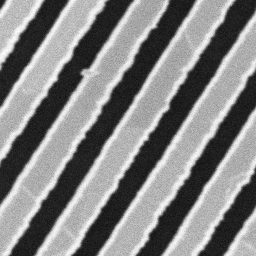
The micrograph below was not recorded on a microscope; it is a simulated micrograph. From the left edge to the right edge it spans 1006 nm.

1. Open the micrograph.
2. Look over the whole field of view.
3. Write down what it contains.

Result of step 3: lines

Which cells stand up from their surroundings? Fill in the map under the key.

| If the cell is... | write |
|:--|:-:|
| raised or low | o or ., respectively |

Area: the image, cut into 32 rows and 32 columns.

.oooo...ooooo...ooooo...ooooo...
ooooo...oooo....oooo....oooo....
oooo...ooooo...ooooo...ooooo...o
ooo...ooooo...ooooo...ooooo....o
oo....oooo....oooo....ooooo...oo
oo...ooooo...ooooo...ooooo...ooo
o....oooo....oooo...ooooo....ooo
o...ooooo...ooooo...ooooo...oooo
...ooooo...ooooo...ooooo...ooooo
...oooo...ooooo....oooo....oooo.
..ooooo...ooooo...ooooo...ooooo.
.ooooo...ooooo...ooooo...ooooo..
.oooo....oooo....oooo....ooooo..
ooooo...ooooo...ooooo...ooooo...
oooo...ooooo....oooo...ooooo...o
ooo....ooooo...ooooo...oooo....o
ooo...ooooo...ooooo...ooooo...oo
oo...ooooo...ooooo....oooo...ooo
o....ooooo...ooooo...oooo....ooo
o...ooooo...ooooo...ooooo...oooo
...ooooo....oooo....oooo....oooo
...ooooo...ooooo...ooooo...ooooo
..ooooo...ooooo...ooooo...ooooo.
..ooooo...ooooo...oooo...ooooo..
.ooooo...ooooo...ooooo...ooooo..
ooooo....oooo...ooooo...ooooo...
ooooo...ooooo...oooo....oooo....
oooo...ooooo...ooooo...ooooo...o
ooo....oooo...ooooo....oooo...oo
ooo...ooooo...ooooo...oooo....oo
oo...ooooo...ooooo...ooooo...ooo
o....oooo....oooo....oooo...oooo